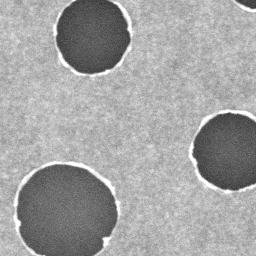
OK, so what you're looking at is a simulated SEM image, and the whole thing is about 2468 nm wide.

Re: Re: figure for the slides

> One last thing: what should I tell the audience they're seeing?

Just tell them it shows holes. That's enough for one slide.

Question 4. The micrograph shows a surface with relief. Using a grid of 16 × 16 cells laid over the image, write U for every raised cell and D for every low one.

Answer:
UUUUDDDUUUUUUUUU
UUUUDDDDUUUUUUUU
UUUUDDDDUUUUUUUU
UUUUDDDDUUUUUUUU
UUUUUDUUUUUUUUUU
UUUUUUUUUUUUUUUU
UUUUUUUUUUUUUUUU
UUUUUUUUUUUUUDDD
UUUUUUUUUUUUDDDD
UUUUUUUUUUUUDDDD
UUUDDUUUUUUUDDDD
UDDDDDDUUUUUUDDD
UDDDDDDUUUUUUUUU
UDDDDDDUUUUUUUUU
UDDDDDDUUUUUUUUU
UUDDDDUUUUUUUUUU